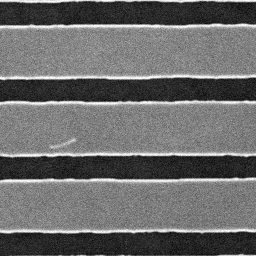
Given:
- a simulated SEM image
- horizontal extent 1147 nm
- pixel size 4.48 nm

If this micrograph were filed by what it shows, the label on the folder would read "lines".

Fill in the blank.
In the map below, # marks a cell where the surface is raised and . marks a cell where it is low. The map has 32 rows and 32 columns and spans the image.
................................
................................
................................
################################
################################
################################
################################
################################
################################
################################
................................
................................
................................
################################
################################
################################
################################
################################
################################
#####.#..#....................#.
................................
................................
################################
################################
################################
################################
################################
################################
################################
................................
................................
................................